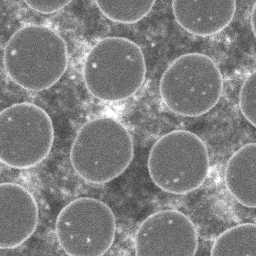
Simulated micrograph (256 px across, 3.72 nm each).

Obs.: raised bodies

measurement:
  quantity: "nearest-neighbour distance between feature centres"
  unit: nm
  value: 291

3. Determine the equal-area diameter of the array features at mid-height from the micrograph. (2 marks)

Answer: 238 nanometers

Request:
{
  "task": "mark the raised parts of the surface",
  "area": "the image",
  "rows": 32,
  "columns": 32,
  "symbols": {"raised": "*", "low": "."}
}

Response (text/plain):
...******...*******...*******...
.....**......******...*******...
..............***.....*******..*
...***.................*****....
.******.........................
.*******....*****...............
.*******...*******..............
.*******...*******....****......
.*******...*******...******.....
.*******..********..********...*
..*****....*******..********..**
...........******...********..**
.............**.....*******...**
.****................*****....**
******.........................*
******.....****................*
*******...******.....***........
*******..********...*****.......
******...********..*******....**
******...********..*******...***
.***.....*******...*******..****
..........*****....*******..****
...........***.....*******..****
***.................*****...****
****.........................***
****.....****.................**
*****...******......**..........
*****..*******....******........
****...*******...*******.....***
****...*******...********..*****
***....*******...********..*****
........*****....*******..******